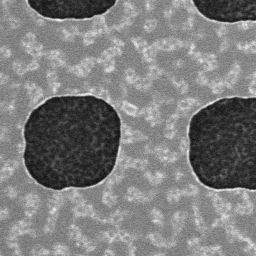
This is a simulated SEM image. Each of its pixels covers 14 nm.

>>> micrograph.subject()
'holes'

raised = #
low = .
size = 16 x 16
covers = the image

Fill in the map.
##.....#####....
################
################
################
################
################
###....######...
##.....#####....
##......####....
##.....#####....
##.....#####....
###...#######...
################
################
################
################